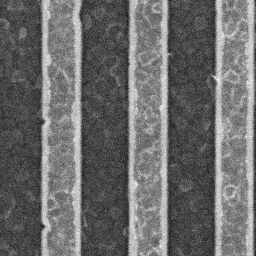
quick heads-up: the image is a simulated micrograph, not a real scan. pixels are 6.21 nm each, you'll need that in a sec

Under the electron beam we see one or a few lines or trenches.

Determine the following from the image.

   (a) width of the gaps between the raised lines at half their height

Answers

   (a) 0.336 um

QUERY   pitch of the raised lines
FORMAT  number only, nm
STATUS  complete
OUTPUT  537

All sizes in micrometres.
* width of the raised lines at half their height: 0.201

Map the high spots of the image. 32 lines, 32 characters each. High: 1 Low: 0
00000011110000000111100000011110
00000011110000000111100000011110
00000011110000000111100000001110
00000011110000000111100000001110
00000011110000000111100000001110
00000011110000000111100000001110
00000011110000000111100000001110
00000011110000000111100000011110
00000011110000000111100000011110
00000011110000000111100000011110
00000011110000000111100000011110
00000011110000000111100000011110
00000011110000000111100000011110
00000011110000000111100000001110
00000011110000000111100000001110
00000011110000000111100000011110
00000011110000000111100000011110
00000011110000000111100000011110
00000011110000000111100000011110
00000011110000000111000000011110
00000011110000000111000000011110
00000011110000000111000000011110
00000011110000000111000000011110
00000011110000000111000000011110
00000011110000000111000000011110
00000011110000000111000000011110
00000011110000000111000000011110
00000011110000000111000000011110
00000011110000000111000000011110
00000011110000000111000000011110
00000011110000000111000000011110
00000011110000000111000000011110